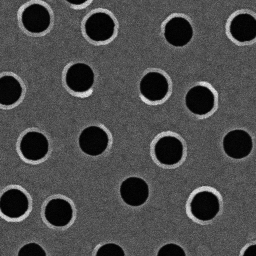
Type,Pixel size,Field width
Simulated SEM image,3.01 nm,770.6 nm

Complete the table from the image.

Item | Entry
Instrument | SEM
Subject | a regular array of holes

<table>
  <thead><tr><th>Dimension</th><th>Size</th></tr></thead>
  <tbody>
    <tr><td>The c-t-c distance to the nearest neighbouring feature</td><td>174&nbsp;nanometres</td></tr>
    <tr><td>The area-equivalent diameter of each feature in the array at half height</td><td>0.0852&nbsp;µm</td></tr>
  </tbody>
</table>